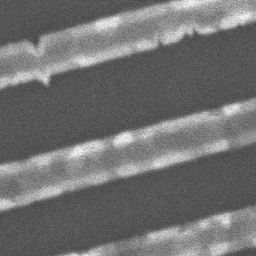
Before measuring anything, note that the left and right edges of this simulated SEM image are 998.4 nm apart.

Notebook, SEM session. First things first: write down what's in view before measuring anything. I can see one or a few lines or trenches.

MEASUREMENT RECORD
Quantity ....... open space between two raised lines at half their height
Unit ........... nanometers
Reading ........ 316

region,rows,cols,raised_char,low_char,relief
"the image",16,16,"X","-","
----------XXXXXX
------XXXXXXXX--
---XXXXXXXX-----
XXXXXXX---------
XXX-------------
----------------
----------------
------------XXXX
--------XXXXXXXX
----XXXXXXXXX---
XXXXXXXXX-------
XXXXX-----------
XX--------------
--------------XX
-----------XXXXX
-------XXXXXXXX-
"